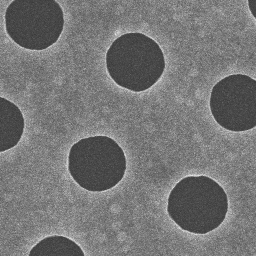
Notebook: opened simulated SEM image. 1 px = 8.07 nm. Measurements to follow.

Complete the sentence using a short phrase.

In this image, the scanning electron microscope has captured holes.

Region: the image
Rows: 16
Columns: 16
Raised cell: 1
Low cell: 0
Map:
0000111111111111
0000111111111111
1000111000111111
1111111000111111
1111111000111111
1111111101111000
0111111111111000
0111111111111100
0111111111111111
1111000011111111
1111000011111111
1111100111100011
1111111111100011
1111111111100011
1111111111110111
1100011111111111